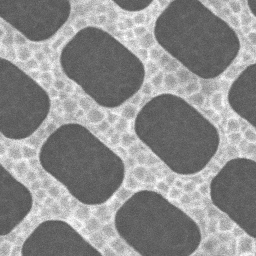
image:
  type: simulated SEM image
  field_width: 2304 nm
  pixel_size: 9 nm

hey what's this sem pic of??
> holes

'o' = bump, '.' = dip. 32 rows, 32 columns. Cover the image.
.........ooooo.....oo....oooooo.
.........ooooooo.ooo......ooooo.
........oooooooooooo........oooo
oo.....ooo...oooooo..........ooo
ooo....oo.....ooooo...........oo
oooooooo.......ooooo..........oo
oooooooo........ooooo.........oo
.oooooo..........ooooo.......ooo
..oooooo..........ooooo.....ooo.
....oooo..........ooooooo..ooo..
.....ooooo........ooooooooooo...
......ooooo......oooooooooooo...
......oooooo....ooo....oooooo...
......ooooooo..ooo......ooooo...
......ooooooooooo........ooooo..
.....ooo..ooooooo..........oooo.
....ooo....oooooo..........ooooo
oooooo......oooooo.........ooooo
ooooo.........ooooo........ooooo
ooooo..........ooooo.......ooooo
ooooo..........oooooo.....oo....
.ooooo..........oooooo...oo.....
..ooooo........ooooooooooo......
...ooooo.......ooooooooooo......
....ooooo.....oo....oooooo......
....ooooooo..oo.......ooooo.....
....ooooooooooo........ooooo....
...ooo.ooooooo..........ooooo...
..oo.....ooooo...........ooooo..
oooo......ooooo..........oooooo.
ooo........ooooo.........ooooooo
ooo.........ooooo.......oooooooo